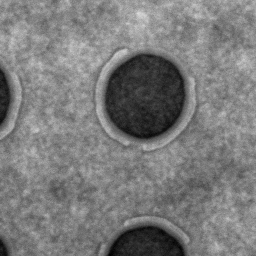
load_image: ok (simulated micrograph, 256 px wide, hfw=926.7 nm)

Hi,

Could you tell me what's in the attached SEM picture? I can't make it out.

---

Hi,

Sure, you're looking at holes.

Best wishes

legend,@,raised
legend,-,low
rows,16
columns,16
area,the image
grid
@@@@@@@@@@@@@@@@
@@@@@@@@@@@@@@@@
@@@@@@@@@@@@@@@@
@@@@@@@@--@@@@@@
@@@@@@@----@@@@@
-@@@@@@-----@@@@
-@@@@@------@@@@
@@@@@@@----@@@@@
@@@@@@@@--@@@@@@
@@@@@@@@@@@@@@@@
@@@@@@@@@@@@@@@@
@@@@@@@@@@@@@@@@
@@@@@@@@@@@@@@@@
@@@@@@@@@@@@@@@@
@@@@@@@@---@@@@@
-@@@@@@-----@@@@